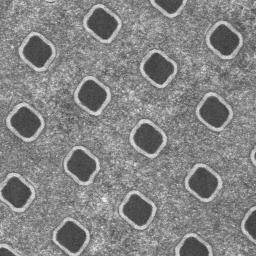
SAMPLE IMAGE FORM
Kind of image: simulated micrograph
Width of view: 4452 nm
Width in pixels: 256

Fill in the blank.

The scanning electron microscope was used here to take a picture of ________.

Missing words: a regular array of raised bodies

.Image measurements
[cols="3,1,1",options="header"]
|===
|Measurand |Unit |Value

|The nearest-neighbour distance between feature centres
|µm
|1.23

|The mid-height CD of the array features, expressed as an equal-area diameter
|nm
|569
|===